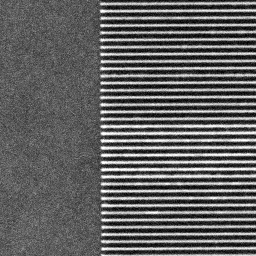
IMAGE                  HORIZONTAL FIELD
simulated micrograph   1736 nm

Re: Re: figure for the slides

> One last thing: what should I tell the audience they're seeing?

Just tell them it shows parallel lines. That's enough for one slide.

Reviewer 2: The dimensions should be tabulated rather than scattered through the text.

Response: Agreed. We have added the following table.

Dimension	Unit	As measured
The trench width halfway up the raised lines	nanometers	39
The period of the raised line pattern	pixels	7.2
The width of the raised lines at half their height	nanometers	12.7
